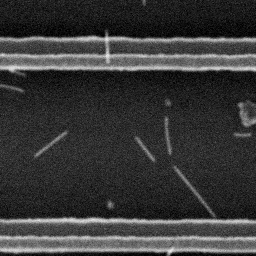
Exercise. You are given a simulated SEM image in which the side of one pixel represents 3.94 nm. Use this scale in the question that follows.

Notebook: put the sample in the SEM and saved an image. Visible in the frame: lines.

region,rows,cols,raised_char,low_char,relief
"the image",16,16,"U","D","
DDDDDDDDDDDDDDDD
DDDDDDDDDDDDDDDD
UUUUUUUUUUUUUUUU
UUUUUUUUUUUUUUUU
DDDDDDDDDDDDDDDD
DDDDDDDDDDDDDDDD
DDDDDDDDDDDDDDDD
DDDDDDDDDDDDDDDD
DDDDDDDDDDDDDDDD
DDDDDDDDDDDDDDDD
DDDDDDDDDDDDDDDD
DDDDDDDDDDDDDDDD
DDDDDDDDDDDDDDDD
DDDDDDDDDDDDDDDD
UUUUUUUUUUUUUUUU
UUUUUUUUUUUUUUUU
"